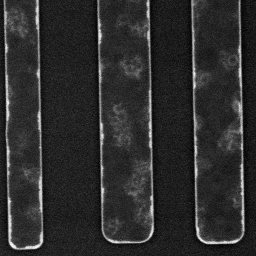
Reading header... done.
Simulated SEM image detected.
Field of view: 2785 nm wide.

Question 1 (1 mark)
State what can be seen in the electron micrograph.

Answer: one or a few lines or trenches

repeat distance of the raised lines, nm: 1060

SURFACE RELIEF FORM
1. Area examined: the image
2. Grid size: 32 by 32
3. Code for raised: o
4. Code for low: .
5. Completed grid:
.oooo.......ooooooo.....oooooo..
.oooo.......ooooooo.....oooooo..
.oooo.......ooooooo.....oooooo..
.oooo.......ooooooo.....oooooo..
.oooo.......ooooooo.....oooooo..
.oooo.......ooooooo.....oooooo..
.oooo.......ooooooo.....oooooo..
.oooo.......ooooooo.....oooooo..
.oooo.......ooooooo.....oooooo..
.oooo.......ooooooo.....oooooo..
.oooo.......ooooooo.....oooooo..
.oooo.......ooooooo.....oooooo..
.oooo........oooooo.....oooooo..
.oooo........oooooo.....oooooo..
.oooo........oooooo.....oooooo..
.oooo........oooooo.....oooooo..
.oooo........oooooo.....oooooo..
.oooo........oooooo.....oooooo..
.oooo........oooooo.....oooooo..
.oooo........oooooo.....oooooo..
.oooo........oooooo.....oooooo..
.oooo........oooooo.....oooooo..
.oooo........oooooo.....oooooo..
.oooo........oooooo.....oooooo..
.oooo........oooooo.....oooooo..
.oooo........oooooo.....oooooo..
.oooo........oooooo......ooooo..
.oooo........oooooo......ooooo..
.oooo........oooooo......ooooo..
.oooo........oooooo......ooooo..
.oooo...........................
................................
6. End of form